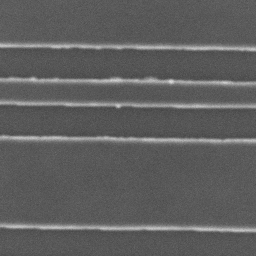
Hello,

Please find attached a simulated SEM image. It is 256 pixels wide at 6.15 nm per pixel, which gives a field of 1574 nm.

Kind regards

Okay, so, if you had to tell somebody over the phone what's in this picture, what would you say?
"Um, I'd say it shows lines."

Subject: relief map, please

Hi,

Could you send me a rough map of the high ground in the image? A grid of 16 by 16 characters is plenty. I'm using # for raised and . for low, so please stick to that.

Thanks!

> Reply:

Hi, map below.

################
################
################
................
................
################
.###############
................
................
################
################
################
################
################
................
................